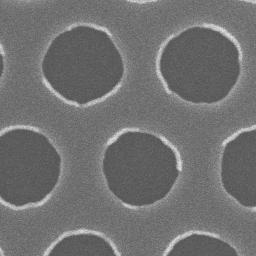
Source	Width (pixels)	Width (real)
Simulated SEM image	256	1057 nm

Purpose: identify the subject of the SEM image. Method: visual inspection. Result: holes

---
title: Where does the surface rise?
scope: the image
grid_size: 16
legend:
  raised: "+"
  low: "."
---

++++++++++++++++
++++++++++++++++
+++....++++...++
+++.....++.....+
+++.....++.....+
+++....++++....+
++++++++++++++++
++++++++++++++++
...+++++..+++++.
....+++....+++..
....++.....+++..
...++++....+++..
...+++++..+++++.
++++++++++++++++
++++++++++++++++
+++....++++....+